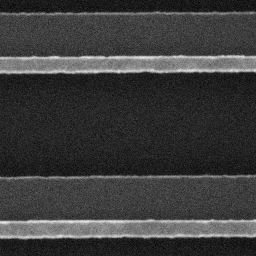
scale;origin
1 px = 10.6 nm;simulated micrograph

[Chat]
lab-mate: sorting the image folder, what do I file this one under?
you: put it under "lines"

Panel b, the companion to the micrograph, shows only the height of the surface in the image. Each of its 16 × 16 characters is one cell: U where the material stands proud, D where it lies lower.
DDDDDDDDDDDDDDDD
UUUUUUUUUUUUUUUU
UUUUUUUUUUUUUUUU
UUUUUUUUUUUUUUUU
UUUUUUUUDUUDUDDD
DDDDDDDDDDDDDDDD
DDDDDDDDDDDDDDDD
DDDDDDDDDDDDDDDD
DDDDDDDDDDDDDDDD
DDDDDDDDDDDDDDDD
DDDDDDDDDDDDDDDD
UUUUUUUUUUUUUUUU
UUUUUUUUUUUUUUUU
UUUUUUUUUUUUUUUU
UUUUUUUUUUUUUUUU
DDDDDDDDDDDDDDDD